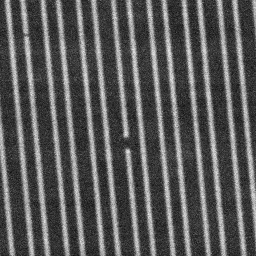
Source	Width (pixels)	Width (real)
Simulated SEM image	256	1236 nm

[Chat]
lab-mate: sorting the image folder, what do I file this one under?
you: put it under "parallel lines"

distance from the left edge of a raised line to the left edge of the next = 0.0845 µm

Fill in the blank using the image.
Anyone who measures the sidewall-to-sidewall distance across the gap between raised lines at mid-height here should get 11.8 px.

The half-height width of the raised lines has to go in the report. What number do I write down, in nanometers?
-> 20.4